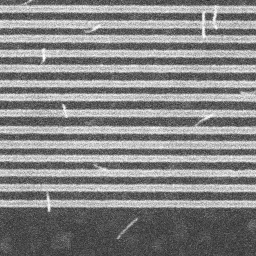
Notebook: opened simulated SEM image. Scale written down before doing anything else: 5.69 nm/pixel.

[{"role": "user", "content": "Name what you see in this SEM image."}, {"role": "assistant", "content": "parallel lines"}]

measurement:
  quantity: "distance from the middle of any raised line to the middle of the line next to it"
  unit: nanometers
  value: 85.1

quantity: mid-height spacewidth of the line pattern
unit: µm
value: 0.0512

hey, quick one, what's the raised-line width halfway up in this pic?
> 35.5 nm